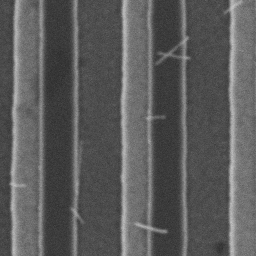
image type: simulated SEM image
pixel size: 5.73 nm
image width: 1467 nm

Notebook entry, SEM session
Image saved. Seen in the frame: lines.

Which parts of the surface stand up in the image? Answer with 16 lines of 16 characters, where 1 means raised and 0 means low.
0111100011100011
0111100011110011
0111100011110011
0111100011110011
0111100011110011
0111100011110011
0111100011110011
0111100011110011
0111100011110011
0111100011110011
0111100011110011
0111100011110011
0111100011110011
0111100011110011
0111100011110011
0111100011110011